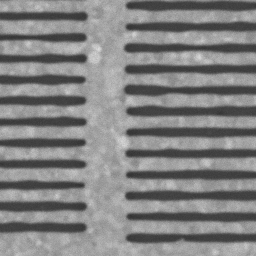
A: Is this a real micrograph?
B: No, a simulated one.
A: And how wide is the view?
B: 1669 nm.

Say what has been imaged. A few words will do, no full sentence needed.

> groups of lines, slits or small figures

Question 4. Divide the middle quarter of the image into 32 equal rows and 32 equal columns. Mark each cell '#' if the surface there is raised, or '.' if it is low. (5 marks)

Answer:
################................
###############.................
################........########
.....###########################
.....###########################
################........########
###############.................
################..........####..
.....###########################
.....###########################
...###############.......######.
################................
################................
.....###########################
......##########################
.....###########################
################................
################................
################################
.....###########################
.....###########################
################................
###############.................
##########################......
.....###########################
.....###########################
#############################...
################................
################................
....############################
.....###########################
#########################..#####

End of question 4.